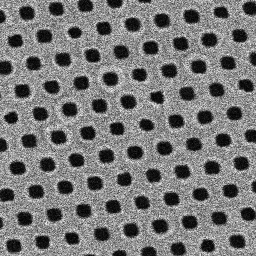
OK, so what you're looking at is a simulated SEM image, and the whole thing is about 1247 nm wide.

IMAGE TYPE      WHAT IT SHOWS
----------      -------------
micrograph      a regular array of holes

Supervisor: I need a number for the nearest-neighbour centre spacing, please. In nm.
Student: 142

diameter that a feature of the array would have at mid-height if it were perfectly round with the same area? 69.9 nanometers